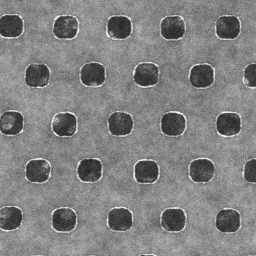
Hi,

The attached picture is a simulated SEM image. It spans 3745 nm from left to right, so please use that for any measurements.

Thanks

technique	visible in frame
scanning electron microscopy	a regular array of raised bodies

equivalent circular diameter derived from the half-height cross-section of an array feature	26.2	pixels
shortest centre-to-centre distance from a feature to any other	782	nanometers